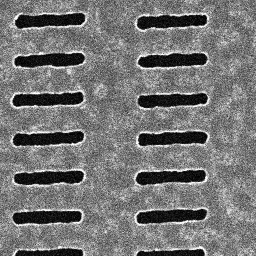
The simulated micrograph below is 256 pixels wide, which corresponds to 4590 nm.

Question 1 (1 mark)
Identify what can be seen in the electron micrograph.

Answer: a regular array of holes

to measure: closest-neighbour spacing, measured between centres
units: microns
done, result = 0.696